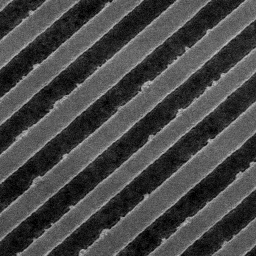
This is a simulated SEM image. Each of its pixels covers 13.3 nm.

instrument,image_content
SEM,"lines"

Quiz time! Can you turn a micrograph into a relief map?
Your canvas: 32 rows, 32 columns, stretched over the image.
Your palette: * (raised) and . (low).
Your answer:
*....****....****.....****....**
....****....****....*****....***
...****....****....*****....****
..****....****....****.....****.
.****....****....****.....***...
****....****....****....****....
**.....***.....****....****....*
*.....***.....****....****....**
....****....*****....****....***
...****....****.....****....***.
..****....****....*****....***..
.****....****....****.....***...
****....****....****....****....
**.....****....****....****....*
*.....****....****....****....**
....*****....****....****....***
...*****....****....***.....****
..****.....****...****....*****.
.****....****.....***....*****..
****....****....****....*****...
***....****....****....****.....
**....****....****....****....**
*...*****....****....****....***
....****....***.....****....****
..****.....***....*****....****.
.****.....***....*****....****..
****....****....*****....****...
***....****....****....****.....
**....****....****....****.....*
*....****....****....****....***
....***.....****....****....****
...***....*****....****....****.